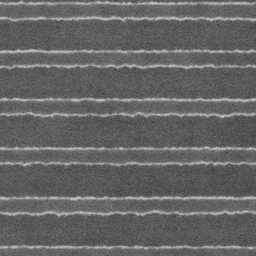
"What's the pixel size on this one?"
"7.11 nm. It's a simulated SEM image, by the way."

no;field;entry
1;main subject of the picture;lines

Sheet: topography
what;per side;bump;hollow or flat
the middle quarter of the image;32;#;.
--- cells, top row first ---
###.#...###.###.#.#####.....####
................................
................................
................................
................................
................................
................................
................................
................................
################################
################################
################################
################################
................................
................................
................................
................................
................................
................................
................................
................................
################################
################################
################################
################################
................................
................................
................................
................................
................................
................................
................................